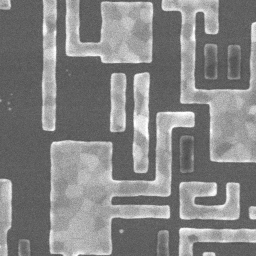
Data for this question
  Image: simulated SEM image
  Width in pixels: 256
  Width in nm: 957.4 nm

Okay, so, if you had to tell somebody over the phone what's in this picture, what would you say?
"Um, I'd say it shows wiring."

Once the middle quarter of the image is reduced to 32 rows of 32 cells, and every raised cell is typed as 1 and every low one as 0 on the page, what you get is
00000000000000000000000000000111
00000000000000000000000000000111
00000000000001100001100000000111
00000000000011100011100000000111
00000000000011100011100000000111
00000000000011100011100000000111
00000000000011100011100000000111
00000000000011100011100000000111
00000000000011100011100000000111
00000000000011100011100000000111
00000000000011100011100000000000
00000000000011100011100000000000
00000000000011100000100111111111
00000000000001100101100111111111
00000000000000100111100111111111
00000000000010000011100111111111
00000000000011100011100001100000
00000000000000000011100110100000
00000000000000000110000111100111
11110000000000000110000111100111
11111111111100000100100111100111
11111111111100000111100110100111
11100111111100000111100111100111
11111111111100000111100111100111
11111111111100000011100111100111
11111111111100000011100111100111
11111111111100000011100111100111
11111111111100000000000111100000
11111111111100000000000111100000
11111111111111111111111111100000
11111111111111111111111111000111
11111111111111111111111111000111